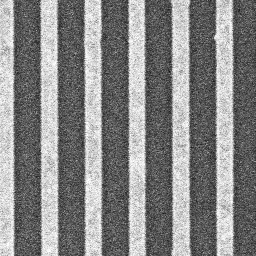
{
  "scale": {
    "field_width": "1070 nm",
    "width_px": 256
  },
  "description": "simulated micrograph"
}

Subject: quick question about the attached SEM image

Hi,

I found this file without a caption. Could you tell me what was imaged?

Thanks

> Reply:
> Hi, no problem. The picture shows parallel lines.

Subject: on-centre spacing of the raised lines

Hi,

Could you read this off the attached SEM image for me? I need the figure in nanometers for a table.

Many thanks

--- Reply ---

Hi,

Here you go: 183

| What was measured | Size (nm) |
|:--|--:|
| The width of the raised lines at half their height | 61.6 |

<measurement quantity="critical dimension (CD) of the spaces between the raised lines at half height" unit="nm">120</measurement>